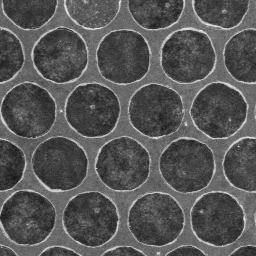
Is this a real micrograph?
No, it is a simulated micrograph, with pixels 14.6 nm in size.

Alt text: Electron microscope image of a regular array of holes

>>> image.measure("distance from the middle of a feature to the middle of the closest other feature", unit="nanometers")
903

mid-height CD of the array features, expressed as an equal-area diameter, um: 0.795